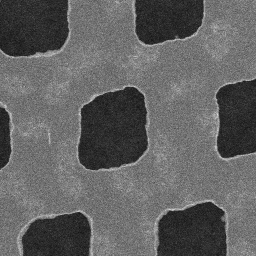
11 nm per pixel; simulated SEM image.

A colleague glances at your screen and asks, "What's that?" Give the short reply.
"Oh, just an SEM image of holes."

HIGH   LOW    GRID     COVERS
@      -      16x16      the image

----@@@@-----@@@
----@@@@-----@@@
----@@@@@--@@@@@
@-@@@@@@@@@@@@@@
@@@@@@@@@@@@@@@@
@@@@@@@@@@@@@@--
@@@@@----@@@@@--
-@@@@----@@@@@--
-@@@@----@@@@@--
-@@@@----@@@@@--
@@@@@--@@@@@@@@@
@@@@@@@@@@@@@@@@
@@@@@@@@@@@@@@@@
@@@--@@@@@----@@
@-----@@@@----@@
@-----@@@@----@@